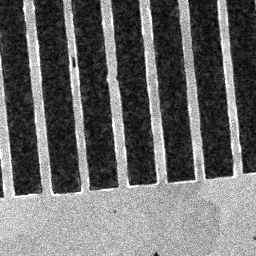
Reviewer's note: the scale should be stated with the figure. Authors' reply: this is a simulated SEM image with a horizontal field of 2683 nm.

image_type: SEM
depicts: parallel lines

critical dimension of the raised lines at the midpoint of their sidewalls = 0.0925 microns